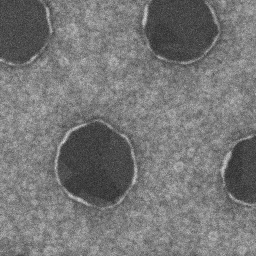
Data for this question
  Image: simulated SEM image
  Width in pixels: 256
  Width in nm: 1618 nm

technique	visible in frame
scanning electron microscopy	raised bodies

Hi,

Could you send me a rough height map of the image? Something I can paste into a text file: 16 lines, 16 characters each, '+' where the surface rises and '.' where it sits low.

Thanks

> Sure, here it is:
+++......++++...
+++......+++++..
+++......+++++..
++........+++...
................
................
................
................
....++++........
....++++......++
...+++++......++
....++++......++
.....+++.......+
................
................
................